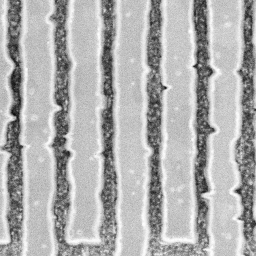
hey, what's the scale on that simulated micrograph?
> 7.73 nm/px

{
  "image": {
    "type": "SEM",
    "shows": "parallel lines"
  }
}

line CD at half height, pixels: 28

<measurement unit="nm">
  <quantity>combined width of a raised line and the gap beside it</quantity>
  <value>360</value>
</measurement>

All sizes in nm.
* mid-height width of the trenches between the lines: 139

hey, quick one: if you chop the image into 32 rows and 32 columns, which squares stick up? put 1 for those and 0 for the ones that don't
10011110011100011100111100111100
10011100011100011100011100111100
10011100011110011100011100111100
10011110011110011100111100111100
10011100011100011100111100111100
10011100011110011100111100111100
10011110011100111100011100111100
10011110011100111100111100111100
11011110011100111100111100011100
10011110011100111100111100011100
10011110011100111100011100111100
10011110011100011100011100111100
10011110011110011100011100111100
10011110011110011100011100011100
10011110011100011100011100111100
10011110011100011100011100011100
10011110011100011100111100011100
00011100011110011100011100111000
00011100011110011110111100111000
10011110011100011110111100111000
10011110011110011100111100111000
10011110011110011100111100111100
10011110011110011100111100111100
10011110011100011100111100111000
10011100011100011100011100111100
10011100011100011100011100111100
10011100011100011100011100111100
10011100011100011100011100111100
10011100011100011100011100111100
10011110011100011100111100111100
00011110000000011100000000011100
00011110000000011100000000111100